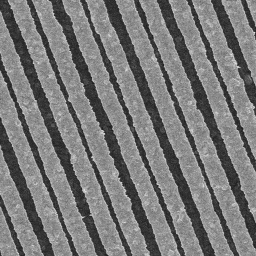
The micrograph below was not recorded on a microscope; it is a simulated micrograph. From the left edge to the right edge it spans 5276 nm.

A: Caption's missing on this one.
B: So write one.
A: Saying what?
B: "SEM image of parallel lines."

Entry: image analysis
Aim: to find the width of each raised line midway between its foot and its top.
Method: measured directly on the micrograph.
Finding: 338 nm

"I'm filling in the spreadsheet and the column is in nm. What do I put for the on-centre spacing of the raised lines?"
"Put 510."